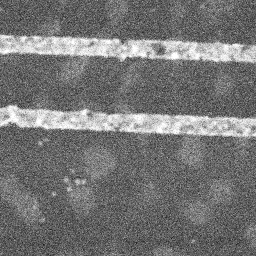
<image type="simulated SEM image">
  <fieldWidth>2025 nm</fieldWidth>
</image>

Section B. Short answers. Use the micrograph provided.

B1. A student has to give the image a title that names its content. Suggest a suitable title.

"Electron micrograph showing one or a few lines or trenches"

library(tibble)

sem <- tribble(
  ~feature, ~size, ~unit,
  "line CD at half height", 126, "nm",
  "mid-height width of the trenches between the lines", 460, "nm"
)